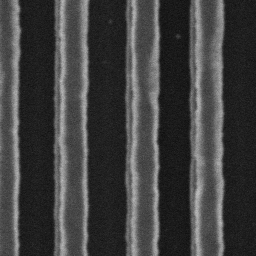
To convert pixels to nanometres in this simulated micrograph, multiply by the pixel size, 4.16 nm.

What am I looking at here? lines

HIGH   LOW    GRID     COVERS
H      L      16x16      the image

HLLHHHLLHHLLHHLL
HLLHHLLLHHLLHHLL
HLLLHLLLHHLLHHLL
HLLHHLLLHHLLHHLL
HLLHHLLLHHLLHHLL
HLLHHLLLHHLLHHLL
HLLHHLLLHHLLHHLL
HLLHHLLLHHLLHHLL
HLLHHLLLHHLLHHLL
HLLHHLLLHHLLHHLL
HLLHHLLLHHLLHHLL
HLLHHLLLHHLLHHLL
HLLHHLLLHHLLHHLL
HLLHHLLLHHLLHHLL
HLLHHLLLHHLLHHLL
HLLHHLLLHHLLHHLL